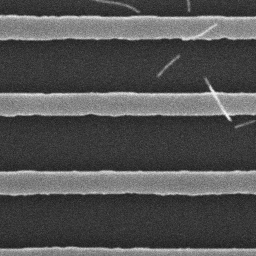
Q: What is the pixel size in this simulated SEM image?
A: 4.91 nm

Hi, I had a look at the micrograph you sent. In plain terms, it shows lines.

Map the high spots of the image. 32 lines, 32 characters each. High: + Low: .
................................
................................
++++++++++++++++++++++++++++++++
++++++++++++++++++++++++++++++++
++++++++++++++++++++++++++++++++
................................
................................
................................
................................
................................
................................
..........................+.....
++++++++++++++++++++++++++++++++
++++++++++++++++++++++++++++++++
................................
................................
................................
................................
................................
................................
................................
.+++++++++++++++++++++++++++++++
++++++++++++++++++++++++++++++++
++++++++++++++++++++++++++++++++
................................
................................
................................
................................
................................
................................
................................
++++++++++++++++++++++++++++++++